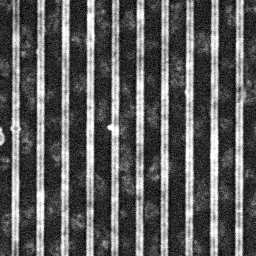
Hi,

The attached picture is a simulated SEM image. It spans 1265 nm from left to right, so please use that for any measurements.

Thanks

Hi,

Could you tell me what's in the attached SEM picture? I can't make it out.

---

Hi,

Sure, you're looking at parallel lines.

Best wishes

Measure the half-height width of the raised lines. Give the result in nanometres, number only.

25.9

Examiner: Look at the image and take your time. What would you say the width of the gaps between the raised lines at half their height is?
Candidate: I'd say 98.1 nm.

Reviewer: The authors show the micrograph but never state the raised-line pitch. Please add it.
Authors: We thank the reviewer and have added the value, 123 nm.